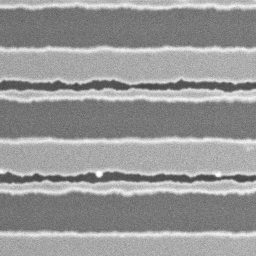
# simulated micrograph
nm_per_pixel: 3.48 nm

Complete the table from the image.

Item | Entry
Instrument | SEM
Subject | lines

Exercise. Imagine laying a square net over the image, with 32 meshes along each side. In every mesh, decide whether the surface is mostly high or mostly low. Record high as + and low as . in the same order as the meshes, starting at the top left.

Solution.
++++++++++++++++++++++++++++++++
................................
................................
................................
................................
................................
++++++++++++++++++++++++++++++++
++++++++++++++++++++++++++++++++
++++++++++++++++++++++++++++++++
++++++++++++++++++++++++++++++++
++++++++++++++++++++++++++++++++
++++++++++++++++++++++++++++++++
..++.................+.+++......
................................
................................
................................
................................
.....++.............++++++++....
++++++++++++++++++++++++++++++++
++++++++++++++++++++++++++++++++
++++++++++++++++++++++++++++++++
++++++++++++++++++++++++++++++++
++++++++++++++++++++++++++++++++
++++++++++++++++++++++++++++++++
................................
................................
................................
................................
................................
++++++++++++++++++++++++++++++++
++++++++++++++++++++++++++++++++
++++++++++++++++++++++++++++++++